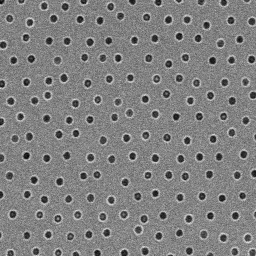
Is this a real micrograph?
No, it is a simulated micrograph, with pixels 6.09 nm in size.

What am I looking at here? a regular array of holes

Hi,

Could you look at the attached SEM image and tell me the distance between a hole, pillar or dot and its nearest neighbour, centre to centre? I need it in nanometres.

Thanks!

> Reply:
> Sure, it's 112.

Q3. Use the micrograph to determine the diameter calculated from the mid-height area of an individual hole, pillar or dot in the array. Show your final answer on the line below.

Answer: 47.1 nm